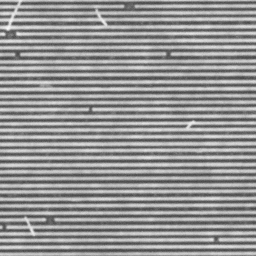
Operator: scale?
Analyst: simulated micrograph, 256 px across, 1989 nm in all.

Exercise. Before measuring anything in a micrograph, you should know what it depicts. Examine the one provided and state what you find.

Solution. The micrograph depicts parallel lines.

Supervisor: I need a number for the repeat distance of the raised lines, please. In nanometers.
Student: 53.4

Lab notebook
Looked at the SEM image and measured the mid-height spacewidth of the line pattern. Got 29.1 nm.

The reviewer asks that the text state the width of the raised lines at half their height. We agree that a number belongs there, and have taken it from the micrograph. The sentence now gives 21.4 nm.